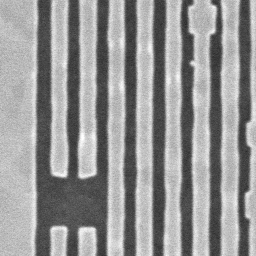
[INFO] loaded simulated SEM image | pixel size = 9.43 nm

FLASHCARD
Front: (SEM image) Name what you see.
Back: wiring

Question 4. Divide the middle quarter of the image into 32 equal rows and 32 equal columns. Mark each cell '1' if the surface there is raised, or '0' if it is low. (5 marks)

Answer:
10001111000111100011110000111000
10001111000111100011110000111000
10001111000111100011110000111000
10001111000111100011110000111000
00001111000111100011110000111000
00001111000111100011110000111000
00001111000111100011110000111000
10001111000111100011110000111000
10001111000111100011110000111000
10001111000111100011110000111000
10001111000111100011110000111000
10001111000111100011110000111000
00001111000111100011110000111000
00001111000111100011110000111000
00001111000111100011110000111000
00001111000111100011110000111000
00001111000111100011110000111000
10001111000111100011110000111000
10001111000111100011110000111000
10001111000111100011110000111000
10001111000111100011110000111000
10001111000111100011110001111000
10001111000111100011110001111000
10001111000111100011110001111000
10001111000111100011110001111000
10001111000111100011110001111000
10001111000111000001110001111000
10001111000111100001110001111000
00000000000111100011110001111000
00000000000111100011110001111000
00000000000111100011110001111000
00000000000111100011110000111000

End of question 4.